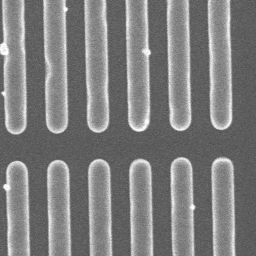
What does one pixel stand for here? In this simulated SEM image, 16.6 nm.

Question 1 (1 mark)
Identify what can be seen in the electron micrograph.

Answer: groups of lines, slits or small figures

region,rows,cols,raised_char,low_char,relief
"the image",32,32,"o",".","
ooo...oo...oo...oo...ooo..ooo...
ooo...oo...oo...oo...ooo..ooo...
ooo...oo...oo...oo...ooo..ooo...
ooo...oo...oo...oo...ooo..ooo...
.oo...oo...oo...oo...ooo..ooo...
ooo...oo...oo...oo...ooo..ooo...
ooo...oo...oo...ooo..ooo..ooo...
.oo...oo...oo...ooo..ooo..ooo...
.oo...oo...oo...ooo..ooo..ooo...
.oo...oo...oo...ooo..ooo..ooo...
.oo...oo...oo...ooo..ooo..ooo...
ooo...oo...oo...ooo..ooo..ooo...
.oo...oo...oo...ooo..ooo..ooo...
.oo...oo...oo...ooo..ooo..ooo...
.oo...oo...oo...ooo..ooo..ooo...
.oo...oo...oo...oo...ooo...oo...
.oo.............................
................................
................................
................................
.oo...oo....o....oo...oo...oo...
.oo...oo...ooo..ooo..ooo...oo...
.oo...ooo..ooo..ooo..ooo...oo...
.oo...ooo..ooo..ooo..ooo...oo...
.oo...ooo..ooo..ooo..ooo...oo...
.oo...ooo..ooo..ooo...oo...oo...
.ooo..ooo..ooo..ooo...oo...oo...
.ooo..ooo..ooo..ooo...oo...oo...
.ooo..ooo..ooo..ooo...oo...oo...
.ooo..ooo..ooo..ooo...oo...oo...
.ooo..ooo..ooo..ooo...oo...oo...
.ooo..ooo..ooo..ooo...oo...oo...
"